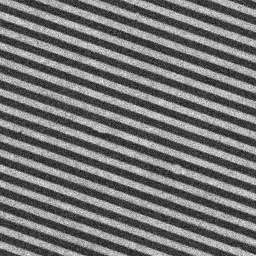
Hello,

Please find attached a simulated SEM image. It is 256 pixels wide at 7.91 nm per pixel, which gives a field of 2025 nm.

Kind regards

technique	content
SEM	parallel lines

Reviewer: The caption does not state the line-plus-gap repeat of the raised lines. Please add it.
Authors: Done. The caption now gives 0.114 µm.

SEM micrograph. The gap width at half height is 57.8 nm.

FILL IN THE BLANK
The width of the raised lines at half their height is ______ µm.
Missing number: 0.0578